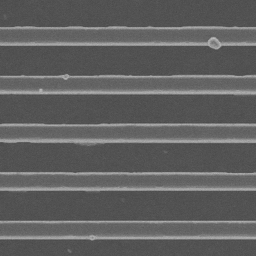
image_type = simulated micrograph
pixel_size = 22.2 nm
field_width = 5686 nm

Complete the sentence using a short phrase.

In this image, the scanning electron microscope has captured lines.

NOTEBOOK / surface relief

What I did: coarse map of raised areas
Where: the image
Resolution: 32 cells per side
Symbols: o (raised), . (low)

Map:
................................
................................
................................
oooooooooooooooooooooooooooooooo
oooooooooooooooooooooooooooooooo
oooooooooooooooooooooooooooooooo
................................
................................
................................
.......oo....oo........oooooo..o
oooooooooooooooooooooooooooooooo
oooooooooooooooooooooooooooooooo
................................
................................
................................
................................
oooooooooooooooooooooooooooooooo
oooooooooooooooooooooooooooooooo
................................
................................
................................
................................
oooooooooooooooooooooooooooooooo
oooooooooooooooooooooooooooooooo
................................
................................
................................
................................
oooooooooooooooooooooooooooooooo
oooooooooooooooooooooooooooooooo
................................
................................